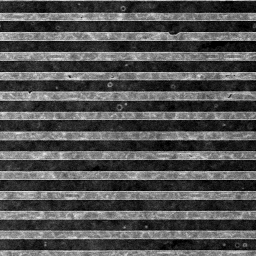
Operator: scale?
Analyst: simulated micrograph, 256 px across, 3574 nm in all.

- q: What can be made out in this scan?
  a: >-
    parallel lines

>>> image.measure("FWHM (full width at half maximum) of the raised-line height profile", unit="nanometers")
112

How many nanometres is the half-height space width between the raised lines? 164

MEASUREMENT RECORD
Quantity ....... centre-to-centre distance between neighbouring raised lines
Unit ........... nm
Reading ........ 277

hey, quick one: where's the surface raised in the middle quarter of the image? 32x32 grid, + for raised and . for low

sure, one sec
................................
................................
+.++++++++++++++++++++++++++++++
+.++++++++++.+++++++++++++++++++
................................
...........+....................
................................
++++++++++++++++++++++++++++++++
++++++++++++++++++++++++++++++++
................................
................................
................................
++++++++++++++++++++++++++++++++
++++++++++++++++++++++++++++++++
................................
................................
................................
++++++++++++++++++++++++++++++++
++++++++++++++++++++++++++++++++
................................
................................
................................
+++++++++++++++++++++++++++++...
++++++++++++++++++++++++++++++++
................................
................................
................................
+++++++++++++++++++++++++++++.++
++++++++++++++++++++++++++++++++
................................
................................
................................